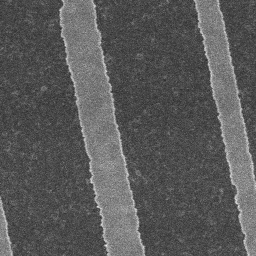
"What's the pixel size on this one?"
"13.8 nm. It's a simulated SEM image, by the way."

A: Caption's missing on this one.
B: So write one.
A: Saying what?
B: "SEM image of one or a few lines or trenches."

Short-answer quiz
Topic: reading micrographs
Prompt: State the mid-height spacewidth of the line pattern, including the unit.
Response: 1380 nanometers